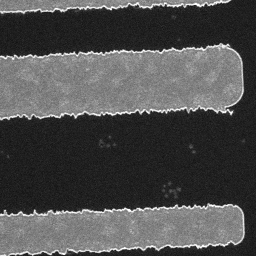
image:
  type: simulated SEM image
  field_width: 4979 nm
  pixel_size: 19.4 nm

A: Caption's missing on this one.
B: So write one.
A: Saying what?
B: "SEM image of one or a few lines or trenches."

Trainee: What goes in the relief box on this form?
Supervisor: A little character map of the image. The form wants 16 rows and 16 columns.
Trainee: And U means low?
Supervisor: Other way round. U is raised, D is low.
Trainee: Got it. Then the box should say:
UUUUUDDDDDDDDDDD
DDDDDDDDDDDDDDDD
DDDDDDDDDDDDDDDD
DDDUUUUUUUUUUUUD
UUUUUUUUUUUUUUUD
UUUUUUUUUUUUUUUD
UUUUUUUUUUUUUUUD
DDDDDDDDDDDDDDDD
DDDDDDDDDDDDDDDD
DDDDDDDDDDDDDDDD
DDDDDDDDDDDDDDDD
DDDDDDDDDDDDDDDD
DDDDDDDDDDDDDDDD
UUUUUUUUUUUUUUUD
UUUUUUUUUUUUUUUD
UUUUUUUUUDDDDDDD